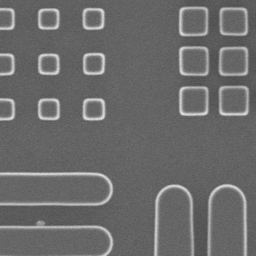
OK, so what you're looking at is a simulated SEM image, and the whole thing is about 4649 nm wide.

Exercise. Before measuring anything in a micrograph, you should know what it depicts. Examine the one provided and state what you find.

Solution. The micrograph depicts groups of lines, slits or small figures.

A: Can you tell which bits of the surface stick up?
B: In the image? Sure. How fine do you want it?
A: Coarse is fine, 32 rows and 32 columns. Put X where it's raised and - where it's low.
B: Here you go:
--------------------------------
XX---XX----XX----------XXX--XXX-
XX---XX---XXX----------XXX--XXX-
X----XX----X-----------XXX--XXX-
--------------------------------
--------------------------------
-----------------------XXX--XXX-
XX---XX----XX----------XXX--XXX-
XX---XX----XX----------XXX--XXX-
--------------------------------
--------------------------------
-----------------------XXX--XXX-
X----XX----X-----------XXX--XXX-
XX---XX----XX----------XXX--XXX-
XX---XX----XX-------------------
--------------------------------
--------------------------------
--------------------------------
--------------------------------
--------------------------------
--------------------------------
--------------------------------
XXXXXXXXXXXXXX------------------
XXXXXXXXXXXXXX-------XX----XX---
XXXXXXXXXXXXXX------XXXX--XXXX--
XXXXXXXXXXXXX-------XXXX--XXXXX-
--------------------XXXX--XXXXX-
--------------------XXXX--XXXXX-
XXXXXXXXXXXXX-------XXXX--XXXXX-
XXXXXXXXXXXXXX-----XXXXX--XXXXX-
XXXXXXXXXXXXXX-----XXXXX--XXXXX-
XXXXXXXXXXXXXX-----XXXXX--XXXXX-